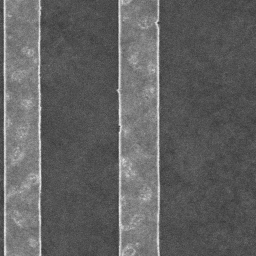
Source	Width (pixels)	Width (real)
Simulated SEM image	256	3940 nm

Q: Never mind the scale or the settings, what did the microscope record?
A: one or a few lines or trenches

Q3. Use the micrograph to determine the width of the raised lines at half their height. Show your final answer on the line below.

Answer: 583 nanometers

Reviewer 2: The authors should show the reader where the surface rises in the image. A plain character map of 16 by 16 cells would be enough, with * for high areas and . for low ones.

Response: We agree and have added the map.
***....***......
**.....***......
**.....***......
**.....***......
**.....***......
**.....***......
**......**......
**......**......
**......**......
**......**......
**......**......
**......**......
**......**......
**......**......
**......**......
**......**......